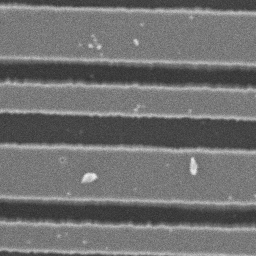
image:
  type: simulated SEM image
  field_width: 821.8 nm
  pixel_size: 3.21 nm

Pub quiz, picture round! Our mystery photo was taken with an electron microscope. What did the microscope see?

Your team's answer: lines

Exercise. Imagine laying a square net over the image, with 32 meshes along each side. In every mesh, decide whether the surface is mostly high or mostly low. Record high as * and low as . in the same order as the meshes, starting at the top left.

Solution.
................................
********************************
********************************
********************************
********************************
********************************
********************************
........************************
................................
................................
****....*.*.....................
********************************
********************************
********************************
................****************
................................
................................
................................
******************..............
********************************
********************************
********************************
********************************
********************************
********************************
.......................*********
................................
................................
****************************.***
********************************
********************************
...*****************************